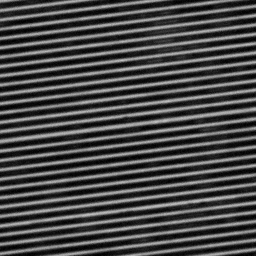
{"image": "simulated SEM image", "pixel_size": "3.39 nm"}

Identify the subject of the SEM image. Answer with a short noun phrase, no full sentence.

parallel lines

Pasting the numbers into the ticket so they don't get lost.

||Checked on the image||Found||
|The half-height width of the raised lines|2.74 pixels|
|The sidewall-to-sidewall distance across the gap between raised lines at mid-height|21.9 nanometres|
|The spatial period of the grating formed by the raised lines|31.5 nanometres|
